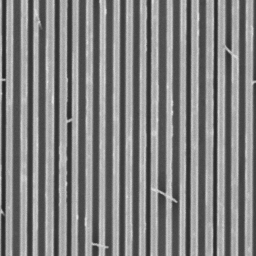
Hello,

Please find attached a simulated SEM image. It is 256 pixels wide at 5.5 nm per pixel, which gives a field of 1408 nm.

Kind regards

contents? parallel lines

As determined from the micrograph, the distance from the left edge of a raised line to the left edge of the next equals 73.3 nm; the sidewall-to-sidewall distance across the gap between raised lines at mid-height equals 35.1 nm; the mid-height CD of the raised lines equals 40.6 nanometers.